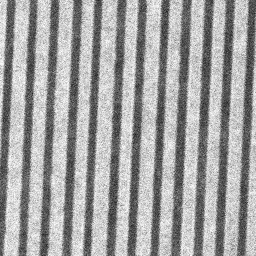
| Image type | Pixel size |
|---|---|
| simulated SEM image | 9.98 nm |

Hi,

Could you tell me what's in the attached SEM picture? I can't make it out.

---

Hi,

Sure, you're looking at parallel lines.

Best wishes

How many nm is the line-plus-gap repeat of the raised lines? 218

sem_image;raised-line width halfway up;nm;113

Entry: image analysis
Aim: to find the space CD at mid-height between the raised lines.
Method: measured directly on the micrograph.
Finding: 105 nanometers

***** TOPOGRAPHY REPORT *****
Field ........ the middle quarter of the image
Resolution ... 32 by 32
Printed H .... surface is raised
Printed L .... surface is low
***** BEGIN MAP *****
HLLLHHHLLHHHLLLHHLLLHHHLLLHHHLLL
HLLLHHLLLHHHLLLHHLLLHHHLLLHHHLLL
HLLLHHLLLHHHLLLHHLLLHHHLLLHHHLLL
HLLLHHLLLHHHLLLHHLLLHHHLLLHHLLLL
HLLLHHLLLHHHLLLHHLLLHHHLLLHHLLLH
HLLLHHLLLHHHLLLHHLLLHHHLLLHHLLLH
HLLLHHLLLHHHLLLHHLLLHHHLLLHHLLLH
HLLLHHLLLHHHLLLHHLLLHHHLLLHHLLLH
HLLLHHLLLHHHLLLHHLLLHHHLLLHHLLLH
HLLLHHLLLHHHLLLHHLLLHHHLLLHHLLLH
HLLLHHLLLHHHLLLHHLLLHHHLLLHHLLLH
HLLLHHLLLHHHLLLHHLLLHHHLLLHHLLLH
HLLLHHLLLHHHLLLHHLLLHHHLLLHHLLLH
HLLLHHLLLHHHLLLHHLLLHHHLLHHHLLLH
HLLHHHLLLHHHLLLHHLLLHHHLLLHHLLLH
HLLHHHLLLHHHLLLHHLLLHHHLLLHHLLLH
HLLHHHLLLHHHLLLHHLLLHHHLLHHHLLLH
HLLHHHLLLHHHLLHHHLLLHHHLLHHHLLLH
LLLHHHLLLHHHLLHHHLLHHHHLLHHHLLLH
LLLHHHLLLHHHLLHHHLLHHHLLLHHHLLLH
LLLHHHLLHHHHLLHHHLLHHHLLLHHHLLLH
LLLHHHLLHHHLLLHHHLLHHHLLLHHHLLLH
LLLHHHLLHHHLLLHHLLLHHHLLLHHHLLLH
LLLHHLLLHHHLLLHHLLLHHHLLLHHHLLLH
LLLHHLLLHHHLLLHHLLLHHHLLLHHHLLLH
LLLHHLLLHHHLLLHHLLLHHHLLLHHLLLLH
LLLHHLLLHHHLLLHHLLLHHHLLLHHLLLHH
LLLHHLLLHHHLLLHHLLLHHHLLLHHLLLHH
LLLHHLLLHHHLLLHHLLLHHHLLLHHLLLHH
LLLHHLLLHHHLLLHHLLLHHHLLLHHLLLHH
LLLHHLLLHHHLLLHHLLLHHHLLLHHLLLHH
LLLHHLLLHHHLLLHHLLLHHHLLLHHLLLHH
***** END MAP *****